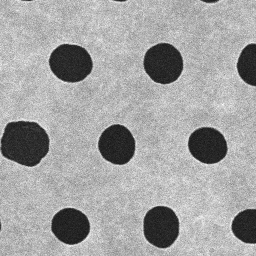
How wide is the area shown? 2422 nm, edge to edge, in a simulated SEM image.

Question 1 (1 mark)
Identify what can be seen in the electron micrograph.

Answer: holes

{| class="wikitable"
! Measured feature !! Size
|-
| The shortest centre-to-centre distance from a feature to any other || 856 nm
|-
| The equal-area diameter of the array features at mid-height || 39.6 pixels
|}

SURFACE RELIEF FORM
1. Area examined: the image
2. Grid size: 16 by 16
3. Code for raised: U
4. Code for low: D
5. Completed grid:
UUUUUUUUUUUUUUUU
UUUUUUUUUUUUUUUU
UUUUUUUUUUUUUUUU
UUUDDDUUUDDUUUUD
UUUDDDUUUDDUUUUD
UUUUUUUUUUUUUUUU
UUUUUUUUUUUUUUUU
UUUUUUUUUUUUUUUU
DDDUUUDDUUUUDDUU
DDDUUUDDUUUUDDUU
UUUUUUUUUUUUUUUU
UUUUUUUUUUUUUUUU
UUUUUUUUUUUUUUUU
UUUDDUUUUDDUUUUD
UUUDDDUUUDDUUUUD
UUUUUUUUUUUUUUUU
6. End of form